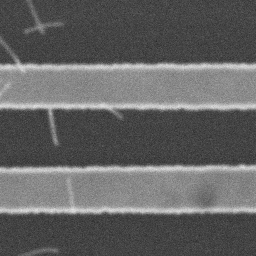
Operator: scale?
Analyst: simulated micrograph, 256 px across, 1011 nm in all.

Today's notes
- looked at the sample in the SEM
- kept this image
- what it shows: lines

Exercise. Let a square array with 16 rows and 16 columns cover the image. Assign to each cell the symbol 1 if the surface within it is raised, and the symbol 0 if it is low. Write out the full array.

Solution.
0000000000000000
0000000000000000
0000000000000000
0000000000000000
1111111111111111
1111111111111111
1111111111111111
0000000000000000
0000000000000000
0000000000000000
0000011111111111
1111111111111111
1111111111111111
0000000000000000
0000000000000000
0000000000000000